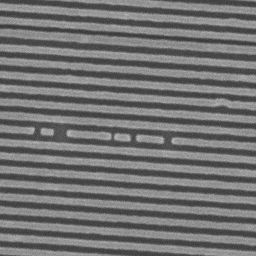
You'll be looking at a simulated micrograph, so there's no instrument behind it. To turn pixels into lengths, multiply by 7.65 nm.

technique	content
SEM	parallel lines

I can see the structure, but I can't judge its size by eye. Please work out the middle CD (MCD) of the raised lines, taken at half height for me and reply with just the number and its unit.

51.5 nanometers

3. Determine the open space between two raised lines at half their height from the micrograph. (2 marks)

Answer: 58.2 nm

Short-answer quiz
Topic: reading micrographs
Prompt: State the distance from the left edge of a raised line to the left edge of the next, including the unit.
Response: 104 nanometres